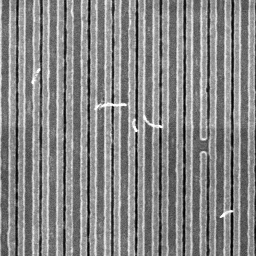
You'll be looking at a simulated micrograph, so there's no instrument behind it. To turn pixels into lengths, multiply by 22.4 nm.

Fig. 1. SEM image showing parallel lines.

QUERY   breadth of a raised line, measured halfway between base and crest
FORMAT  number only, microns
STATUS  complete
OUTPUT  0.14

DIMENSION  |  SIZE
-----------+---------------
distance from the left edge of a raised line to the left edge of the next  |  267 nanometers